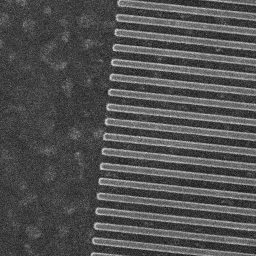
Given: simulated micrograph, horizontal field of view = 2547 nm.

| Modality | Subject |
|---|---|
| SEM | parallel lines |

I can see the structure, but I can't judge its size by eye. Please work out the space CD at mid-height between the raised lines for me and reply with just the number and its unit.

0.0878 µm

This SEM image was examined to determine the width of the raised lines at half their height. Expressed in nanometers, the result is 61.8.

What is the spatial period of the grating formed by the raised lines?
149 nm